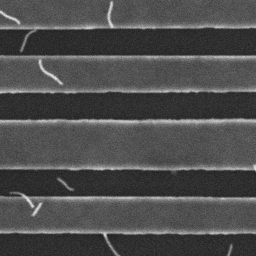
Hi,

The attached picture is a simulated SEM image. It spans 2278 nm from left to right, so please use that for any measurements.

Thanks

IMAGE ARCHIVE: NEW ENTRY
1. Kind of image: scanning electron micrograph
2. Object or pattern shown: lines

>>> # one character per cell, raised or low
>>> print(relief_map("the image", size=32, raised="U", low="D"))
UUUUUUUUUUUUUUUUUUUUUUUUUUUUUUUU
UUUUUUUUUUUUUUUUUUUUUUUUUUUUUUUU
UUUUUUUUUUUUUUUUUUUUUUUUUUUUUUUU
UUUUUUUUUUUUDDDDDUDUDDDDDDDDDDDD
DDDDDDDDDDDDDDDDDDDDDDDDDDDDDDDD
DDDDDDDDDDDDDDDDDDDDDDDDDDDDDDDD
DDDDDDDDDDDDDDDDDDDDDDDDDDDDDDDD
UUUUUUUUUUUUUUUUUUUUUUUUUUUUUUUU
UUUUUUUUUUUUUUUUUUUUUUUUUUUUUUUU
UUUUUUUUUUUUUUUUUUUUUUUUUUUUUUUU
UUUUUUUUUUUUUUUUUUUUUUUUUUUUUUUU
UUDDDUUDUUDDDDDDDDDDDDDDDDDDDDDD
DDDDDDDDDDDDDDDDDDDDDDDDDDDDDDDD
DDDDDDDDDDDDDDDDDDDDDDDDDDDDDDDD
DDDDDDDDDDDDDDDDDDDDDDDDDDDDDDDD
UUUUUUUUUUUUUUUUUUUUUUUUUUUUUUUU
UUUUUUUUUUUUUUUUUUUUUUUUUUUUUUUU
UUUUUUUUUUUUUUUUUUUUUUUUUUUUUUUU
UUUUUUUUUUUUUUUUUUUUUUUUUUUUUUUU
UUUUUUUUUUUUUUUUUUUUUUUUUUUUUUUU
UUUUUUUUUUUUUUUUUUUUUUUUUUUUUUUU
DDDDDDDDDDDDDDDDDDDDDDDDDDDDDDDD
DDDDDDDDDDDDDDDDDDDDDDDDDDDDDDDD
DDDDDDDDDDDDDDDDDDDDDDDDDDDDDDDD
DDDDDDDDDDDDDDDDDDDDDDDDDDDDDDDD
UUUUUUUUUUUUUUUUUUUUUUUUUUUUUUUU
UUUUUUUUUUUUUUUUUUUUUUUUUUUUUUUU
UUUUUUUUUUUUUUUUUUUUUUUUUUUUUUUU
UUUUUUUUUUUUUUUUUUUUUUUUUUUUUUUU
DDDDDDDDDDDDDDDDDDDDDDDDDDDDDDDD
DDDDDDDDDDDDDDDDDDDDDDDDDDDDDDDD
DDDDDDDDDDDDDDDDDDDDDDDDDDDDDDDD